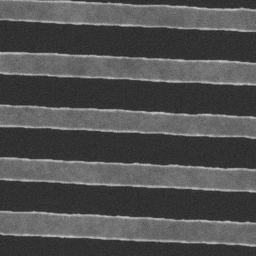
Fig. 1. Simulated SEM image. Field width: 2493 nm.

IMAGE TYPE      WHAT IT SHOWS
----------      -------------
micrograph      lines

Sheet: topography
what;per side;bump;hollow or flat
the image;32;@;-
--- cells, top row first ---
@@@@@@@@@@@@@@@@----------------
@@@@@@@@@@@@@@@@@@@@@@@@@@@@@@@@
-@@@@@@@@@@@@@@@@@@@@@@@@@@@@@@@
----------------------@@@@@@@@@@
--------------------------------
--------------------------------
--------------------------------
@@@@@@@@@@@@@@@@@@@@@@@---------
@@@@@@@@@@@@@@@@@@@@@@@@@@@@@@@@
-------@@@@@@@@@@@@@@@@@@@@@@@@@
-----------------------------@@@
--------------------------------
--------------------------------
@@@@@@--------------------------
@@@@@@@@@@@@@@@@@@@@@@@@@@@@@---
@@@@@@@@@@@@@@@@@@@@@@@@@@@@@@@@
--------------@@@@@@@@@@@@@@@@@@
--------------------------------
--------------------------------
--------------------------------
@@@@@@@@@@@@@@@@@@--------------
@@@@@@@@@@@@@@@@@@@@@@@@@@@@@@@@
@@@@@@@@@@@@@@@@@@@@@@@@@@@@@@@@
----------------------@@@@@@@@@@
--------------------------------
--------------------------------
@@------------------------------
@@@@@@@@@@@@@@@@@@@@@@----------
@@@@@@@@@@@@@@@@@@@@@@@@@@@@@@@@
-----@@@@@@@@@@@@@@@@@@@@@@@@@@@
----------------------------@@@@
--------------------------------